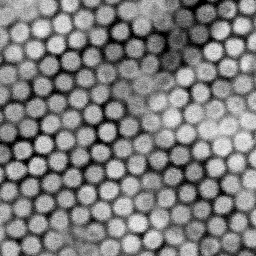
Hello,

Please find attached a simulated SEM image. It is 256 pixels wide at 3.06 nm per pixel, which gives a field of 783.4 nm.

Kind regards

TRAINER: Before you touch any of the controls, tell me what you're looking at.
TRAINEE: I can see a regular array of raised bodies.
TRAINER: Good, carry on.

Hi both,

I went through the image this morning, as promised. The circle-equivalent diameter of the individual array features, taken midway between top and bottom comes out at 50.8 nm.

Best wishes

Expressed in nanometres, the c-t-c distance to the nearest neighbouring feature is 65.6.